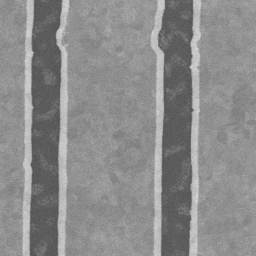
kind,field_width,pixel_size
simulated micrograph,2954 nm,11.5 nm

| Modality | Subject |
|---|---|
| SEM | one or a few lines or trenches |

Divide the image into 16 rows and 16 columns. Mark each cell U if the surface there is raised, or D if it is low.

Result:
UUDDUUUUUUDDUUUU
UUDDUUUUUUDDUUUU
UUDDUUUUUUDDUUUU
UUDDUUUUUUDDUUUU
UUDDUUUUUUDDUUUU
UUDDUUUUUUDDUUUU
UUDDUUUUUUDDUUUU
UUDDUUUUUUDDUUUU
UUDDUUUUUUDDUUUU
UUDDUUUUUUDDUUUU
UUDDUUUUUUDDUUUU
UUDDUUUUUUDDUUUU
UUDDUUUUUUDDUUUU
UUDDUUUUUUDDUUUU
UUDDUUUUUUDDUUUU
UUDDUUUUUUDDUUUU